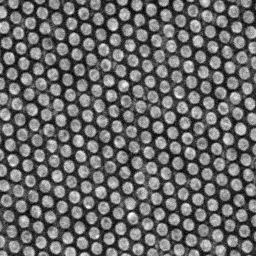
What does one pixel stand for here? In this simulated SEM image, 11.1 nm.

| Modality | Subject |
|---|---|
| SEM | a regular array of raised bodies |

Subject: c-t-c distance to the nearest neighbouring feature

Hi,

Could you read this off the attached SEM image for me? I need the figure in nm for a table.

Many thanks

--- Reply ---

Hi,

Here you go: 170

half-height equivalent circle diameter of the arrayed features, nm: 120